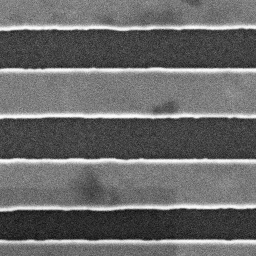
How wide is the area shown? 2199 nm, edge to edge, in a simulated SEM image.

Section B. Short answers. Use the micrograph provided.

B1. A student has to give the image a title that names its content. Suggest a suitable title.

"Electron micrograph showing lines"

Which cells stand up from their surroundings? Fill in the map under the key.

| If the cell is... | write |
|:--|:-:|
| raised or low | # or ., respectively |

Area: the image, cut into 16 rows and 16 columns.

################
################
................
................
################
################
################
................
................
................
################
################
################
................
................
################